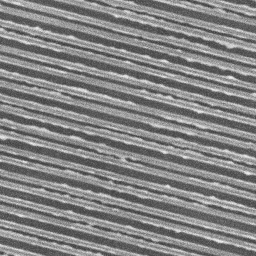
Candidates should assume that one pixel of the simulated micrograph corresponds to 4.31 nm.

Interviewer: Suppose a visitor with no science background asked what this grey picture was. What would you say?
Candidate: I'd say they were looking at parallel lines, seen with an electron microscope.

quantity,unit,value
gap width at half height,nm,28.7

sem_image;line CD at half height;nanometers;28.7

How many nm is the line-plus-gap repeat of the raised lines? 51.9